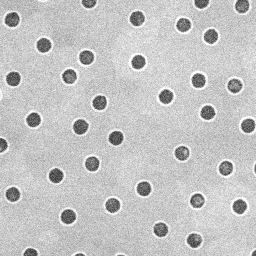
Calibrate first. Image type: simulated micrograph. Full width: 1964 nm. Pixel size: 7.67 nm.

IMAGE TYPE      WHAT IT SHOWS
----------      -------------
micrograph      a regular array of holes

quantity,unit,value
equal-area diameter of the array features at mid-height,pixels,16.3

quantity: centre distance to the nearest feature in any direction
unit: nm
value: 279